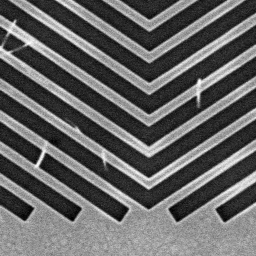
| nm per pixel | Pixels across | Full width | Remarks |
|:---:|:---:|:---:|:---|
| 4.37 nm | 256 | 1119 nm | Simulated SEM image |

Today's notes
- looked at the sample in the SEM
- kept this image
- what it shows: groups of lines, slits or small figures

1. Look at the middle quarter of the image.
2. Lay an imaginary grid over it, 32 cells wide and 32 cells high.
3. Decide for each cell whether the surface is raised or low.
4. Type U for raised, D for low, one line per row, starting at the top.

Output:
UUUDDDDDDDDUUUUDDDDDDDDDDDDDUUUU
UUUUDDDDDDDDUUUUDDDDDDDDDDDUUUDD
DDUUUUDDDDDDDDUUUDDDDDDDDUUUUDDD
DDDUUUUDDDDDDDDUUUUDDDDDUUUDDDDD
DDDDDUUUUDDDDDDDDUUUUDUUUUDDDDDD
DDDDDDUUUUDDDDDDDDUUUUUUDDDDDDDD
DDDDDDDDUUUUDDDDDDDUUUUDDDDDDDDU
UUDDDDDDDUUUUDDDDDDDDDDDDDDDDUUU
UUUDDDDDDDDUUUUDDDDDDDDDDDDDUUUU
DUUUDDDDDDDDUUUUDDDDDDDDDDDUUUDD
DDUUUUDDDDDDDDUUUUDDDDDDDUUUUDDD
DDDDUUUUDDDDDDDUUUUDDDDUUUUDDDDD
DDDDDUUUUDDDDDDDDUUUUDUUUUDDDDDD
DDDDDDUUUUDDDDDDDDUUUUUUDDDDDDDD
DDDDDDDDUUUUDDDDDDDUUUUDDDDDDDDU
UDDDDDDDDUUUUDDDDDDDDDDDDDDDDUUU
UUUUDDDDDDDUUUUDDDDDDDDDDDDDUUUU
DUUUUDDDDDDDUUUUDDDDDDDDDDUUUUDD
DDUUUUDDDDDDDDUUUDDDDDDDDUUUUDDD
DDDDUUUUDDDDDDDDUUUDDDDUUUUDDDDD
DDDDDUUUUDDDDDDDDUUUDDUUUDDDDDDD
DDDDDDUUUUDDDDDDDDDUUUUUDDDDDDDD
DDDDDDDDUUUUDDDDDDDDDUDDDDDDDDDU
UUDDDDDDDUUUUDDDDDDDDDDDDDDDDUUU
UUUDDDDDDDUUUUUDDDDDDDDDDDDDUUUD
UUUUUDDDDDDDUUUUDDDDDDDDDDDUUUDD
DDUUUUDDDDDDDDUUUUDDDDDDDUUUDDDD
DDDDUUUUDDDDDDDDUUUDDDDUUUUDDDDD
DDDDDUUUUDDDDDDDDUUUDDUUUDDDDDDD
DDDDDDUUUUDDDDDDDDDUUUUUDDDDDDDD
UDDDDDDDUUUUDDDDDDDDUUDDDDDDDDDU
UUDDDDDDDDUUUDDDDDDDDDDDDDDDDUUU